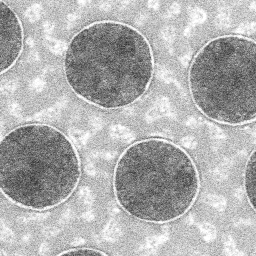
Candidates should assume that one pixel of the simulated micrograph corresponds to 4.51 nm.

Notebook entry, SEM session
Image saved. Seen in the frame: raised bodies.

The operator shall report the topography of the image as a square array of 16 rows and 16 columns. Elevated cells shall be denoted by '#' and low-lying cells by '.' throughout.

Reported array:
#...............
#.....##........
#...#####....###
#...######..####
....######..####
....#####...####
......##....####
.............###
####............
#####...####....
#####..#####...#
#####..#####...#
.###...#####....
........###.....
................
................